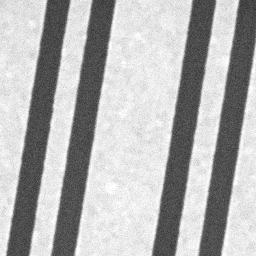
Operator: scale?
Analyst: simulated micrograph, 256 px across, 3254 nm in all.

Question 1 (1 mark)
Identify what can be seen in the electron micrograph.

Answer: lines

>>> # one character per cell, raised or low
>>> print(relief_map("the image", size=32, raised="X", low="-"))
XXXXXX---XX---XXXXXXXXXX---XXX--
XXXXXX---XX---XXXXXXXXXX---XXX--
XXXXX---XXX---XXXXXXXXXX---XX---
XXXXX---XXX---XXXXXXXXX----XX---
XXXXX---XXX---XXXXXXXXX---XXX---
XXXXX---XXX---XXXXXXXXX---XXX---
XXXXX---XX----XXXXXXXXX---XXX---
XXXXX---XX---XXXXXXXXXX---XXX---
XXXX----XX---XXXXXXXXXX---XX---X
XXXX---XXX---XXXXXXXXXX---XX---X
XXXX---XXX---XXXXXXXXX---XXX---X
XXXX---XXX---XXXXXXXXX---XXX---X
XXXX---XX---XXXXXXXXXX---XXX---X
XXXX---XX---XXXXXXXXXX---XXX---X
XXXX---XX---XXXXXXXXXX---XX----X
XXX---XXX---XXXXXXXXXX---XX---XX
XXX---XXX---XXXXXXXXX---XXX---XX
XXX---XXX---XXXXXXXXX---XXX---XX
XXX---XX----XXXXXXXXX---XXX---XX
XXX---XX---XXXXXXXXXX---XXX---XX
XXX---XX---XXXXXXXXXX---XXX---XX
XX---XXX---XXXXXXXXXX---XX---XXX
XX---XXX---XXXXXXXXX----XX---XXX
XX---XXX---XXXXXXXXX---XXX---XXX
XX---XXX---XXXXXXXXX---XXX---XXX
XX---XX---XXXXXXXXXX---XXX---XXX
XX---XX---XXXXXXXXXX---XXX---XXX
X---XXX---XXXXXXXXXX---XX---XXXX
X---XXX---XXXXXXXXXX---XX---XXXX
X---XXX---XXXXXXXXX---XXX---XXXX
X---XX----XXXXXXXXX---XXX---XXXX
X---XX---XXXXXXXXXX---XXX---XXXX